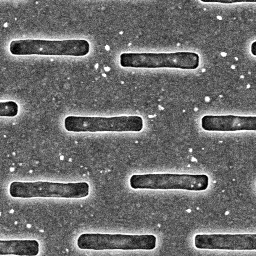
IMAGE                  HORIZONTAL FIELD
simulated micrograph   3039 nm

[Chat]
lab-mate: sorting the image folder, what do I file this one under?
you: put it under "holes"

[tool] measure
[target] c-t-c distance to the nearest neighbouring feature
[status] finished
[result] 1.01 µm